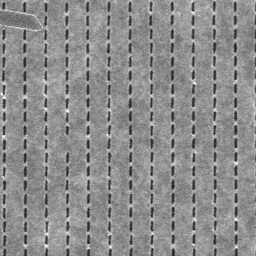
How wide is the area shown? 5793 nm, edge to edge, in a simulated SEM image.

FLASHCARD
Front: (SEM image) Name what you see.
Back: a regular array of holes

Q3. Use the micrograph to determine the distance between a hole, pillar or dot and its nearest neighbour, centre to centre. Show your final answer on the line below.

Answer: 13.4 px